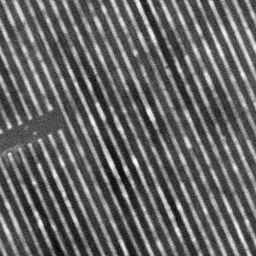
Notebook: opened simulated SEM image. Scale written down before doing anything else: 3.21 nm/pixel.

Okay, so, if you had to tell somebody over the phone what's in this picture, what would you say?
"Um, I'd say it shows parallel lines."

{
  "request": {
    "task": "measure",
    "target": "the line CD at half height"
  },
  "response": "8.8 nm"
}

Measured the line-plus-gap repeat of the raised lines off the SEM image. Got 35.9 nm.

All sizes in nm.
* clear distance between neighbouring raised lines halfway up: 25.7